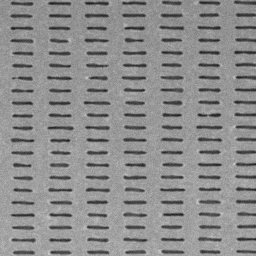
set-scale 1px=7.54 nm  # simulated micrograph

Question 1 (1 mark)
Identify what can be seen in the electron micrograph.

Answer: a regular array of holes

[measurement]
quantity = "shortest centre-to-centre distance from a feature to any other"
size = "93.3 nm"